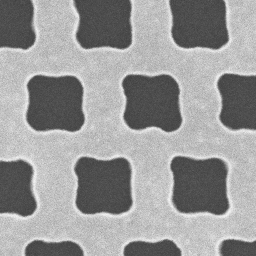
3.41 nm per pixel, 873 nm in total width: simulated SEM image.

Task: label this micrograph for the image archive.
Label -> holes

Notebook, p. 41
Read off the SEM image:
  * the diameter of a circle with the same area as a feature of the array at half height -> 61.9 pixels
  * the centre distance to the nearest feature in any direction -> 0.326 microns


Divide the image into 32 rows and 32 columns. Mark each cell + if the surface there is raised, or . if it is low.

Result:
....+++++.......+++++.......++++
....++++++......+++++.......++++
....++++++......++++++......++++
....++++++.......++++.......++++
....++++++.......++++........+++
....++++++......++++++......++++
++++++++++++++++++++++++++++++++
++++++++++++++++++++++++++++++++
++++++++++++++++++++++++++++++++
++++.....+++++++.....+++++++....
+++.......+++++.......+++++.....
+++.......+++++.......+++++.....
++++......++++++.......+++++....
+++.......++++++.......+++++....
+++........++++........++++.....
++++......++++++.......+++++....
++++++++++++++++++++++++++++++++
++++++++++++++++++++++++++++++++
++++++++++++++++++++++++++++++++
++++++++++++++++++++++.+++++++++
....+++++.......+++++.......++++
....+++++........++++........+++
....++++++......++++++......++++
....++++++......++++++......++++
....+++++........+++++......++++
.....+++++.......+++++.......+++
....++++++......++++++......++++
++++++++++++++++++++++++++++++++
++++++++++++++++++++++++++++++++
++++++++++++++++++++++++++++++++
++++......++++++......++++++....
+++.......+++++........++++.....